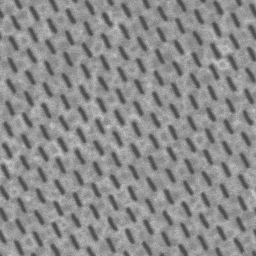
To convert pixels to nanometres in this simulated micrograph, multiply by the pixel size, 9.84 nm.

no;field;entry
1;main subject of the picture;a regular array of holes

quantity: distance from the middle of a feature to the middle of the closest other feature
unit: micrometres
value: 0.205